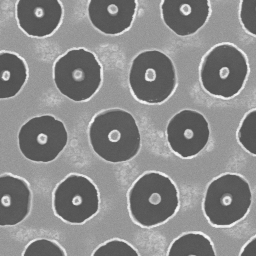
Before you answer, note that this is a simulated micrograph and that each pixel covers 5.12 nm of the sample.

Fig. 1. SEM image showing a regular array of ring-shaped grooves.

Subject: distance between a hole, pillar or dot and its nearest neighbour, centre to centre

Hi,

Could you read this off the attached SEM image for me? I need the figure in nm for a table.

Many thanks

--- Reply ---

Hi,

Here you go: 358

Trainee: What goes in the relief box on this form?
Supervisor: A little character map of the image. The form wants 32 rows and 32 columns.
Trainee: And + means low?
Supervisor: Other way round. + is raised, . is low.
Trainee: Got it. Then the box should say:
++.....++++......+++......++++..
++..+...+++...+..+++...+..++++..
++.....++++.....++++......++++..
+++....+++++....+++++....++++++.
++++..++++++++++++++++++++++++++
++++++++++++++++++++++++++++++++
+++++++++..+++++++..++++++....++
...++++.....+++++....+++++.....+
...++++.....++++......+++......+
+..++++..+...+++..+...+++......+
...++++.....++++......+++.....++
..++++++....+++++....+++++....++
+++++++++.++++++++..++++++++++++
++++++++++++++++++++++++++++++++
+++++.++++++....++++++...++++++.
+++.....+++......++++.....++++..
++......+++...+..++++..+..++++..
++...+..+++...+...+++.....++++..
++......++++.....+++++...++++++.
+++....++++++....++++++.++++++++
++++++++++++++++++++++++++++++++
++++++++++++++++++++++++++++++++
...+++++...++++++....++++++...++
...++++.....+++++.....++++.....+
....+++.....++++...+..++++.....+
+...+++..+..++++......++++..+..+
...++++.....++++......++++.....+
...+++++...++++++....+++++....++
++++++++++++++++++++++++++++++++
+++++++++++++++++++++++..+++++++
++++...++++++...++++++....+++++.
+++.....++++.....++++......+++..